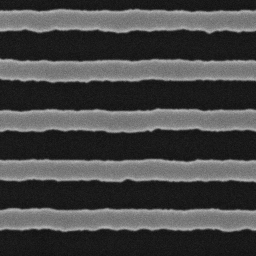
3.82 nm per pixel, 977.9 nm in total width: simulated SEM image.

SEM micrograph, lines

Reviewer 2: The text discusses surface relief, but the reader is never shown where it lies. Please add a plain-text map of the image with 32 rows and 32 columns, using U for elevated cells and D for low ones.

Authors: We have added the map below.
DDDDDDDDDDDDDDDDDDDDDDDDDDDDDDDD
UUUUUUUUUUUUUUUUUUUUUUUUUUUUUUUU
UUUUUUUUUUUUUUUUUUUUUUUUUUUUUUUU
UUUUUUUUUUUUUUUUUUUUUUUUUUUUUUUU
DDDDDDDDDDDDDDDDDDDDDDDDDDDDDDDD
DDDDDDDDDDDDDDDDDDDDDDDDDDDDDDDD
DDDDDDDDDDDDDDDDDDDDDDDDDDDDDDDD
UUDDDDDDDDDDDDDDDDDUUUUDDDDDDDDD
UUUUUUUUUUUUUUUUUUUUUUUUUUUUUUUU
UUUUUUUUUUUUUUUUUUUUUUUUUUUUUUUU
DDDDDDDDDDDDDDDDDDDDDDDDDDDDDDDD
DDDDDDDDDDDDDDDDDDDDDDDDDDDDDDDD
DDDDDDDDDDDDDDDDDDDDDDDDDDDDDDDD
DDDDDDDDDDDDDDDDDDDDDDDDDDDDDDDD
UUUUUUUUUUUUUUUUUUUUUUUUUUUUUUUU
UUUUUUUUUUUUUUUUUUUUUUUUUUUUUUUU
DDDDDDDDDDDDDUUUUDDDDDDDDDDDDDDD
DDDDDDDDDDDDDDDDDDDDDDDDDDDDDDDD
DDDDDDDDDDDDDDDDDDDDDDDDDDDDDDDD
DDDDDDDDDDDDDDDDDDDDDDDDDDDDDDDD
UUUUUUUUUUUUUUUUUUUUUUUUUUUUUUUU
UUUUUUUUUUUUUUUUUUUUUUUUUUUUUUUU
UUUUDUDUUUUUUUUUUUUUUUUUUUUUUUUU
DDDDDDDDDDDDDDDDDDDDDDDDDDDDDDDD
DDDDDDDDDDDDDDDDDDDDDDDDDDDDDDDD
DDDDDDDDDDDDDDDDDDDDDDDDDDDDDDDD
UUUUUUUUUUUUUUUUUUUUUUUUUUUUUUUU
UUUUUUUUUUUUUUUUUUUUUUUUUUUUUUUU
UUUUUUUUUUUUUUUUUUUUUUUUUUUUUUUU
DDDDDDDDDDDDDDDDDDDDDDDDDDDDDDDD
DDDDDDDDDDDDDDDDDDDDDDDDDDDDDDDD
DDDDDDDDDDDDDDDDDDDDDDDDDDDDDDDD